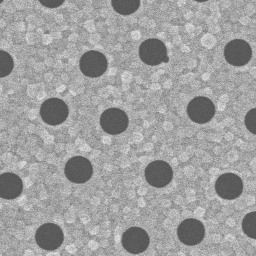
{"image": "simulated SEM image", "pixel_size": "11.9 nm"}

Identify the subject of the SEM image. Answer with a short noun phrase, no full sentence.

a regular array of holes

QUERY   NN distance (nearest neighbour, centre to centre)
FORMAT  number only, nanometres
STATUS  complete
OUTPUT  722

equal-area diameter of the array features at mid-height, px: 28.6